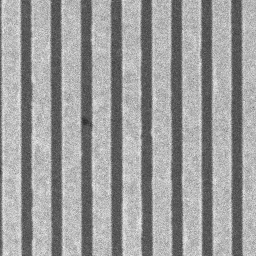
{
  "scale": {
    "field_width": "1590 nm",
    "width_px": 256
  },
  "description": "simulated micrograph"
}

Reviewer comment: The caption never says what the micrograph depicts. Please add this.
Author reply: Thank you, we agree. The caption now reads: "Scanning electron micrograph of parallel lines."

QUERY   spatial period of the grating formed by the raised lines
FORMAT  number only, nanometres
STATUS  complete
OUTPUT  187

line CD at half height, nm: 108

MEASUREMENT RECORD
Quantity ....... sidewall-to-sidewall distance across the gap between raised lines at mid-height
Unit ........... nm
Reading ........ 83.9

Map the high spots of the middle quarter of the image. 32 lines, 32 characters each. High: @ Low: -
@@@@---@@@@----@@@@---@@@@----@@
@@@@---@@@@----@@@@---@@@@----@@
@@@@---@@@@----@@@@---@@@@----@@
@@@@---@@@@----@@@@---@@@@----@@
@@@@---@@@@----@@@@---@@@@----@@
@@@@---@@@@----@@@@---@@@@----@@
@@@@---@@@@----@@@@---@@@@----@@
@@@@---@@@@----@@@@---@@@@----@@
@@@@---@@@@----@@@@---@@@@----@@
@@@@---@@@@----@@@@---@@@@----@@
@@@@---@@@@----@@@@---@@@@----@@
@@@@---@@@@----@@@@---@@@@----@@
@@@@---@@@@----@@@@---@@@@----@@
@@@@---@@@@----@@@@---@@@@@---@@
@@@@---@@@@----@@@@---@@@@@---@@
@@@@---@@@@----@@@@---@@@@@---@@
@@@@----@@@----@@@@---@@@@@---@@
@@@@----@@@----@@@@---@@@@----@@
@@@@----@@@----@@@@---@@@@@---@@
@@@@----@@@----@@@@---@@@@----@@
@@@@----@@@----@@@@---@@@@----@@
@@@@----@@@----@@@@---@@@@----@@
@@@@----@@@----@@@@---@@@@----@@
@@@@----@@@----@@@@---@@@@----@@
@@@@----@@@----@@@@----@@@----@@
@@@@----@@@----@@@@----@@@----@@
@@@@----@@@----@@@@----@@@----@@
@@@@----@@@----@@@@----@@@----@@
@@@@----@@@----@@@@----@@@----@@
@@@@----@@@----@@@@----@@@----@@
@@@@----@@@----@@@@---@@@@----@@
@@@@----@@@----@@@@----@@@@---@@